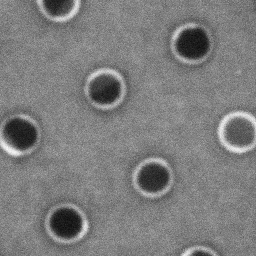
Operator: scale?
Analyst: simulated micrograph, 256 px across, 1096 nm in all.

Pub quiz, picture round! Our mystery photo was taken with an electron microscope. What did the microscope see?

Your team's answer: raised bodies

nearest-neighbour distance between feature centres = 419 nm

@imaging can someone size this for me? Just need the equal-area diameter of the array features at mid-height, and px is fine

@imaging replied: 39